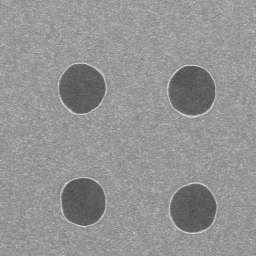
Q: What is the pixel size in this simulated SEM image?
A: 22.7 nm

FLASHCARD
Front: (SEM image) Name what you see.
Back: holes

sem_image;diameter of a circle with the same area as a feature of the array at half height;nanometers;1090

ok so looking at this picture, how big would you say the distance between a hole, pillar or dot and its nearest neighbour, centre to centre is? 2.5 um